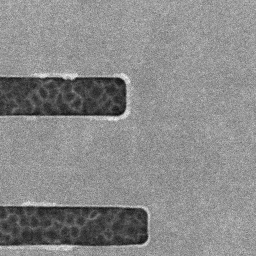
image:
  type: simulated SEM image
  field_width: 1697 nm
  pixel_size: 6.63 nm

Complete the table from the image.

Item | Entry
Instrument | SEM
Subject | one or a few lines or trenches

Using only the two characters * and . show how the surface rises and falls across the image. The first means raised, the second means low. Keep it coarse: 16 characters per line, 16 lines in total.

****************
****************
****************
****************
****************
........********
........********
****************
****************
****************
****************
****************
****************
.........*******
.........*******
****************